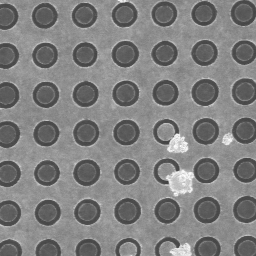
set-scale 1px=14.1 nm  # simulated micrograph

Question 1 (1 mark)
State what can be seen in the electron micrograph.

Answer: a regular array of ring-shaped grooves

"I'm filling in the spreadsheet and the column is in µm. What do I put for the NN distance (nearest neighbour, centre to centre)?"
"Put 0.552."